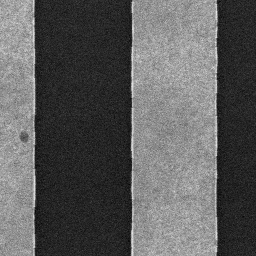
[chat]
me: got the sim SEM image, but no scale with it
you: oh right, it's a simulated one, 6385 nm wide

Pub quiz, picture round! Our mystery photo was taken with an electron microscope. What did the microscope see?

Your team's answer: wiring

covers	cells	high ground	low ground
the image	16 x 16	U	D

UUDDDDDDUUUUUUDD
UUDDDDDDUUUUUUDD
UUDDDDDDUUUUUUDD
UUDDDDDDUUUUUUDD
UUDDDDDDUUUUUUDD
UUDDDDDDUUUUUUDD
UUDDDDDDUUUUUDDD
UUDDDDDDUUUUUUDD
UUDDDDDDUUUUUUDD
UUDDDDDDUUUUUUDD
UUDDDDDDUUUUUUDD
UUDDDDDDUUUUUUDD
UUDDDDDDUUUUUDDD
UUDDDDDDUUUUUUDD
UUDDDDDDUUUUUUDD
UUDDDDDDUUUUUUDD